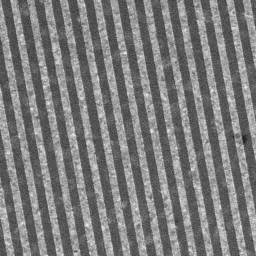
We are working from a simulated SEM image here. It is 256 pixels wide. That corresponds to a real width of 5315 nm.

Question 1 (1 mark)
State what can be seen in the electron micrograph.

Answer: parallel lines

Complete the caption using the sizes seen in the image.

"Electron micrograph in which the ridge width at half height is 138 nanometres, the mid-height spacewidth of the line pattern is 197 nm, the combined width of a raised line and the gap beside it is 16.3 pixels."